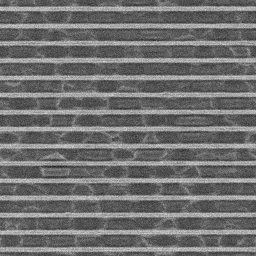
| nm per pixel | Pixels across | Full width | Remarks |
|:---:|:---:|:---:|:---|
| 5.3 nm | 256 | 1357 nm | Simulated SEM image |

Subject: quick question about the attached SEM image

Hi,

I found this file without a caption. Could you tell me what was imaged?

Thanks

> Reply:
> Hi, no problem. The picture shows parallel lines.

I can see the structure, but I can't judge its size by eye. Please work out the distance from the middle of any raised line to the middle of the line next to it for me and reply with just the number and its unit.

91.2 nm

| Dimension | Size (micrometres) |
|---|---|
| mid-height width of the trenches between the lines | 0.0768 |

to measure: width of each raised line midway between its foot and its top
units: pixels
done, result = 2.87